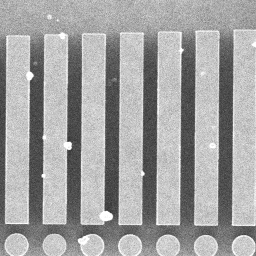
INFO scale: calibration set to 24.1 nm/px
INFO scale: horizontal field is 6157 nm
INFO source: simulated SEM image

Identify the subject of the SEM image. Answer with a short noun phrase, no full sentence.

groups of lines, slits or small figures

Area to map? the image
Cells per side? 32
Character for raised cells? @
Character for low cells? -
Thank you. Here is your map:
--------------------------------
--------------------------------
--------------------------------
--------------------------------
------@@--@@@--@@@--@@@--@@--@@@
-@@@--@@--@@@--@@@--@@@--@@--@@@
-@@@--@@--@@@--@@@--@@@--@@--@@@
-@@@--@@--@@@--@@@--@@@--@@--@@@
-@@@--@@--@@@--@@@--@@@--@@--@@@
-@@@--@@--@@@--@@@--@@@--@@--@@@
-@@@--@@--@@@--@@@--@@@--@@--@@@
-@@@--@@--@@@--@@@--@@---@@--@@@
-@@@--@@--@@@--@@@--@@---@@--@@@
-@@@--@@--@@@--@@@--@@---@@--@@@
-@@@--@@--@@@--@@@--@@---@@--@@@
-@@@--@@--@@@--@@@--@@---@@--@@@
-@@@--@@--@@@--@@@--@@--@@@--@@@
-@@@-@@@--@@@--@@@--@@--@@@--@@@
-@@@--@@@-@@@--@@@--@@--@@@--@@@
-@@@--@@--@@@--@@@--@@--@@@--@@@
-@@@--@@--@@@--@@@--@@--@@@--@@@
-@@@-@@@--@@@--@@@--@@--@@@--@@@
-@@@-@@@--@@@--@@@--@@--@@@--@@@
-@@@-@@@--@@@--@@@--@@--@@@--@@@
-@@@-@@@--@@@--@@@--@@--@@@--@@@
-@@@-@@@--@@@--@@@--@@--@@@--@@@
-@@@-@@@--@@@--@@@--@@--@@@--@@@
-@@@-@@@--@@@--@@@--@@--@@@--@@@
--------------------------------
-@@---@@---@----@---@@----------
-@@@-@@@--@@@--@@@--@@--@@@--@@@
-@@---@@--@@@--@@---@@---@@--@@@